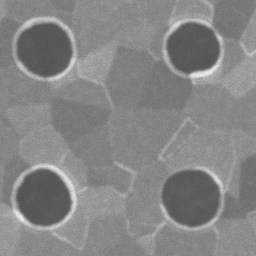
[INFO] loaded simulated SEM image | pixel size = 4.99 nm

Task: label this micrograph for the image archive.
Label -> holes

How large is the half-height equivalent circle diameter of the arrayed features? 277 nanometres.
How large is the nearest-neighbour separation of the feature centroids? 738 nanometers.